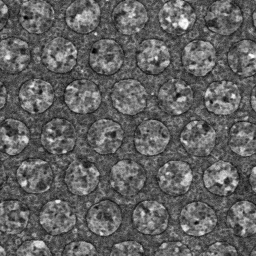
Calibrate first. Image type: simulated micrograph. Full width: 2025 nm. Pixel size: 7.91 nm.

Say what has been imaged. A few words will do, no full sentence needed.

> a regular array of raised bodies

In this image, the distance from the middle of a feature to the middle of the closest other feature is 45.9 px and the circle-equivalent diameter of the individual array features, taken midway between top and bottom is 0.259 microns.